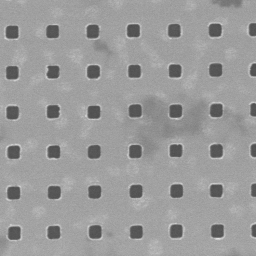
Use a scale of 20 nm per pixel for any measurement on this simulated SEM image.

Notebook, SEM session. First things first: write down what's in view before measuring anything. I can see a regular array of holes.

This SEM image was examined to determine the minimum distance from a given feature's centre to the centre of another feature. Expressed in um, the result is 0.791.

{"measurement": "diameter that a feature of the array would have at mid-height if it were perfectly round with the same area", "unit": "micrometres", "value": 0.288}